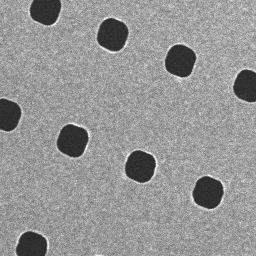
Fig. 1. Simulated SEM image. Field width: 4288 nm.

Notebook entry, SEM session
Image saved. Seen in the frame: holes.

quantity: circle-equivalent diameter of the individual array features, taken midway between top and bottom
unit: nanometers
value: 536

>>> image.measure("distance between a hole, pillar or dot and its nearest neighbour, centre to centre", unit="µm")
1.22